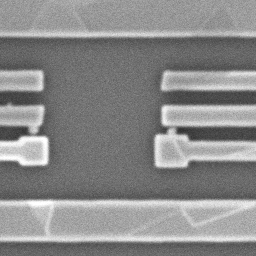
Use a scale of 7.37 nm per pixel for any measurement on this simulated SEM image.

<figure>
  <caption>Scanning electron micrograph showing wiring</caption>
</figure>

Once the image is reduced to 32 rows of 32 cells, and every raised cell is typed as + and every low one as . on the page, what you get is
++++++++++++++++++++++++++++++++
++++++++++++++++++++++++++++++++
++++++++++++++++++++++++++++++++
++++++++++++++++++++++++++++++++
..++++++++++++++++++++++.....+++
................................
................................
................................
................................
+++++...............++++++++++++
+++++...............++++++++++++
................................
................................
+++++................+++++++++++
+++++...............++++++++++++
+++++................+++++++++++
................................
..++++.............+++++........
++++++.............+++++++++++++
++++++.............+++++++++++++
...+++..............+++.........
................................
................................
................................
................................
++++++++++++++++++++++++++++++++
++++++++++++++++++++++++++++++++
++++++++++++++++++++++++++++++++
++++++++++++++++++++++++++++++++
++++++++++++++++++++++++++++++++
................................
................................